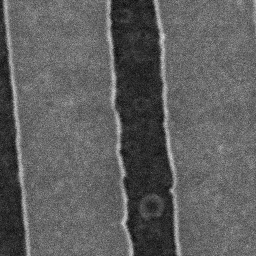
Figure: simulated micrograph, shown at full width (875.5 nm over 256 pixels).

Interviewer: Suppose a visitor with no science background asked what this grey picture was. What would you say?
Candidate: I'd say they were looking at one or a few lines or trenches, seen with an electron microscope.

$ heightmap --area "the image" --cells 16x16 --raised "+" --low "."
+++++++...++++++
+++++++...++++++
.++++++...++++++
.++++++...++++++
.++++++...++++++
.++++++...++++++
.++++++...++++++
.++++++...++++++
.++++++...++++++
.++++++....+++++
.+++++++...+++++
.+++++++...+++++
.+++++++.+.+++++
..++++++...+++++
..++++++...+++++
..++++++...+++++